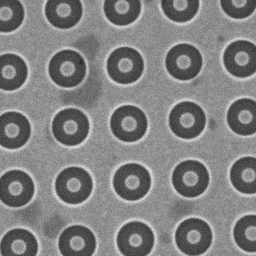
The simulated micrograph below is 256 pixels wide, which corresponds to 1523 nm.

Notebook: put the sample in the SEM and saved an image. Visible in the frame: an array of small figures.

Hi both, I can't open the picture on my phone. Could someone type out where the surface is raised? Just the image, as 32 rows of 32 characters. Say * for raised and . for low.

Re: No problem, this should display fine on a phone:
...***....***.....**.....***....
...***....***.....**.....***....
...***....***....****...********
..*****..***********************
********************************
**********************..*****...
*******...****...****....***....
...***.....**.....***....***....
...***.....**.....***....***....
...***.....***....***...*****..*
...****...*****.****************
********************************
******************************..
********..*****..*****...****...
...****....***....***.....**....
....**.....***.....**.....**....
....***....***....****...****...
....***....****..******.********
*..*****************************
********************************
****************.*****...****...
*..*****...***.....***....***...
....***.....**.....**.....***...
....***.....**.....***....***...
....***....****...*****..*******
*..*****..**********************
********************************
***********************..*****..
**.*****...****....***....***...
....***.....***....***.....**...
.....**.....***....***....****..
.....**.....***....****...*****.